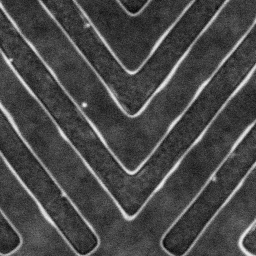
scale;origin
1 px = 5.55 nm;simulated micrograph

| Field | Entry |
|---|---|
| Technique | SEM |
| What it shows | groups of lines, slits or small figures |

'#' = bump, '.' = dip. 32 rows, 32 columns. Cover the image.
#####....######...######....####
.#####....######.######....#####
.######....###########....######
..######....#########.....#####.
...######...#########....######.
....#####....#######....######..
....######....#####....######...
#....######....###.....#####....
##....######...###....#####.....
##.....#####.........######....#
###....######.......######....##
####....######.....######....###
#####....######....#####....####
######....#####...######....####
.#####.....############....#####
..#####....###########....######
..######....#########....######.
...#####.....#######.....#####..
....#####....#######....#####...
....######....#####....######...
#....######....###....######....
##....######....#....######....#
###....#####........######....##
###....######.......######....##
####....######.....######....###
#####....######...######....####
######....#####..######....#####
.#####....############....######
..#####....##########....######.
..######....#########....######.
..#######...########....######..
.#########.##########..########.